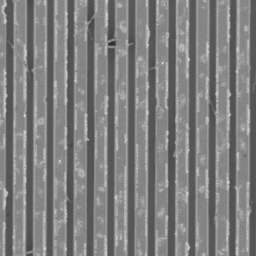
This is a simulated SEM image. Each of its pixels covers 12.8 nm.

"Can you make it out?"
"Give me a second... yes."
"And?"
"parallel lines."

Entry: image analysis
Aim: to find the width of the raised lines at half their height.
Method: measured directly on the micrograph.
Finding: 159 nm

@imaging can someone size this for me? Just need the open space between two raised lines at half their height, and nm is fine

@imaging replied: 97.8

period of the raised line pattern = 260 nm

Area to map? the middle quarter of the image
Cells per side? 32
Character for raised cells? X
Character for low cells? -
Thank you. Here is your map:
X--XXX--XXX--XXX--XXX--XXX--XXX-
X--XXX--XXX--XXX--XXX--XXX--XXX-
X--XXX--XXX--XXX--XXX--XXX--XXX-
X--XXX--XXX--XXX--XXX--XXX--XXX-
---XXX--XXX--XXX--XXX--XXX--XXX-
X--XX---XXX--XXX--XXX--XXX--XXX-
---XX---XXX--XXX--XXX--XXX--XXX-
---XX---XXX--XXX--XXX--XXX--XXX-
X--XX---XXX--XXX--XXX--XXX--XXX-
X--XX---XXX--XXX--XXX--XXX--XXX-
---XX---XXX--XXX--XXX--XXX--XXX-
---XX---XXX--XXX--XXX--XXX--XXX-
---XXX--XXX--XXX--XXX--XXX--XXX-
---XX---XXX--XXX--XXX--XXX--XXX-
---XXX--XXX--XXX--XXX--XXX--XXX-
---XXX--XXX--XXX--XXX--XXX--XXX-
X--XXX--XXX--XXX--XXX--XXX--XXX-
X--XXX--XXX--XXX--XXX--XXX--XXX-
---XXX--XXX--XXX--XXX--XXX--XXX-
---XX---XXX--XXX--XXX--XXX--XXX-
X--XX---XXX--XXX--XXX--XXX--XXX-
---XX---XXX--XXX--XXX--XXX--XXX-
---XX---XXX--XXX--XXX--XXX--XXX-
---XX---XXX--XXX--XXX--XXX--XXX-
---XX---XXX--XXX--XXX--XXX--XXX-
---XX---XXX--XXX--XXX--XXX--XXX-
---XX---XXX--XXX--XXX--XXX--XXX-
---XX---XXX--XXX--XXX--XXX--XXX-
---XX---XXX--XXX--XXX--XXX--XXX-
---XX---XXX--XXX--XXX--XXX--XXX-
---XX---XXX--XXX--XXX--XXX--XXX-
---XX---XXX--XXX--XXX--XXX--XXX-